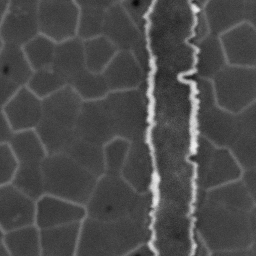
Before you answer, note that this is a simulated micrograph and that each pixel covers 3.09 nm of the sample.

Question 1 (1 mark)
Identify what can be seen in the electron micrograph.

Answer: one or a few lines or trenches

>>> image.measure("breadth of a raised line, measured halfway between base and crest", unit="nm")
139